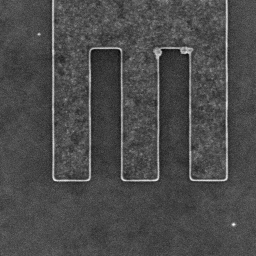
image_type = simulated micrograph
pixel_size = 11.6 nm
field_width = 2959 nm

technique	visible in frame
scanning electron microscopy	groups of lines, slits or small figures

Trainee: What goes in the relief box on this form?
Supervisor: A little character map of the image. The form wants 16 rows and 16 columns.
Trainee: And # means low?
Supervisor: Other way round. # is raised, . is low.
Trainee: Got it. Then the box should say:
...###########..
...###########..
...###########..
...###..##..##..
...###..##..##..
...###..##..##..
...###..##..##..
...###..##..##..
...###..##..##..
...###..##..##..
...###..##..##..
................
................
................
................
................